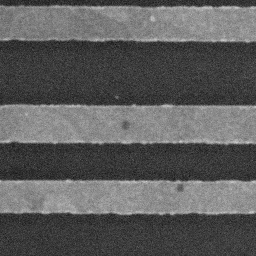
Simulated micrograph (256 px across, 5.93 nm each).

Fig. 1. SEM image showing lines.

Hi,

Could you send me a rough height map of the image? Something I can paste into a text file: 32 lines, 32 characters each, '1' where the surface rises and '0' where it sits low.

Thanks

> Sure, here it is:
00000000000000000000000000000000
11111111111111111111111111111111
11111111111111111111111111111111
11111111111111111111111111111111
11111111111111111111111111111111
00000000000000000000000000000000
00000000000000000000000000000000
00000000000000000000000000000000
00000000000000000000000000000000
00000000000000000000000000000000
00000000000000000000000000000000
00000000000000000000000000000000
00000000000000000000000000000000
11111111111111111111111111111111
11111111111111111111111111111111
11111111111111111111111111111111
11111111111111111111111111111111
11111111111111111111111111111111
00000000000000000000000000000000
00000000000000000000000000000000
00000000000000000000000000000000
00000000000000000000000000000000
00000000000000000000000000000000
11111111111111111111111111111111
11111111111111111111111111111111
11111111111111111111111111111111
00100110011111111111111111111111
00000000000000000000000000000000
00000000000000000000000000000000
00000000000000000000000000000000
00000000000000000000000000000000
00000000000000000000000000000000